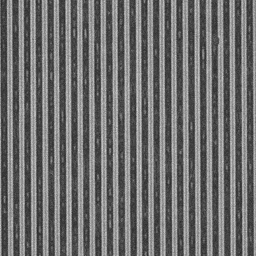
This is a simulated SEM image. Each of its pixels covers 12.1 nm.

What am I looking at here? parallel lines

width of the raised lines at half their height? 51.2 nanometres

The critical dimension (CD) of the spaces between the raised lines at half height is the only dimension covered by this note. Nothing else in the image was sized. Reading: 82.9 nanometers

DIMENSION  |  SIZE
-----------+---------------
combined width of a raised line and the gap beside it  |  141 nanometers